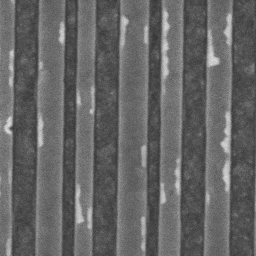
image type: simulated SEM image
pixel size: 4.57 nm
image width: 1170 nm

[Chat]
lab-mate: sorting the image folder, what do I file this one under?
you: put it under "parallel lines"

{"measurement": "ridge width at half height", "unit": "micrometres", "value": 0.113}